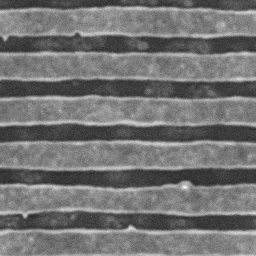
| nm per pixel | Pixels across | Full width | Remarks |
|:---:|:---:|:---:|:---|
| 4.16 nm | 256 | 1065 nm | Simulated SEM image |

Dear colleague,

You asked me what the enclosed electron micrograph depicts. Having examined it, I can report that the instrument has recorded parallel lines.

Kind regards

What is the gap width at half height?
0.0748 um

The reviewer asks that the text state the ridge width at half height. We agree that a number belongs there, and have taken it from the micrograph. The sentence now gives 0.11 micrometres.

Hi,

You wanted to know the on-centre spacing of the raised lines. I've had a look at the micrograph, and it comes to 184 nm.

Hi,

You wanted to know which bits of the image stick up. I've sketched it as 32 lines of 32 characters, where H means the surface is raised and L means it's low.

LLLLLLLLLLLLLLLLLLLLLLLLLLLLLLLL
HHHHHHHHHHHHHHHHHHHHHHHHHHHHHHHH
HHHHHHHHHHHHHHHHHHHHHHHHHHHHHHHH
HHHHHHHHHHHHHHHHHHHHHHHHHHHHHHHH
HLLLLLLLLLLLLLLLLLLHHHHHLHHLLLLL
LLLLLLLLLLLLLLLLLLLLLLLLLLLLLLLL
LLLLLLLLLLLLLLLLLLLLLLLLLLLLLLLL
HHHHHHHHHHHHHHHHHHHHHHHHHHHHHHHH
HHHHHHHHHHHHHHHHHHHHHHHHHHHHHHHH
HHHHHHHHHHHHHHHHHHHHHHHHHHHHHHHH
LLLLLLLLLLLLLLLLLLLLLLLLLLLLLLLL
LLLLLLLLLLLLLLLLLLLLLLLLLLLLLLLL
HHHHHHHHHHHHHHHHHHHHHHHHHLHHHHHH
HHHHHHHHHHHHHHHHHHHHHHHHHHHHHHHH
HHHHHHHHHHHHHHHHHHHHHHHHHHHHHHHH
HHHHHLLLLLLHHHLLLHHHLHHHHHHLHHHH
LLLLLLLLLLLLLLLLLLLLLLLLLLLLLLLL
LLLLLLLLLLLLLLLLLLLLLLLLLLLLLLLL
HHHHHHHHHHHHHHHHHHHHHHHHHHHHHHHH
HHHHHHHHHHHHHHHHHHHHHHHHHHHHHHHH
HHHHHHHHHHHHHHHHHHHHHHHHHHHHHHHH
LLLLLLLLLLLLLLLLLLLLLLLLLLLLLLLL
LLLLLLLLLLLLLLLLLLLLLLLLLLLLLLLL
HHHHHHHHHHHHLLLLLLHHHHHHHHHHHHHH
HHHHHHHHHHHHHHHHHHHHHHHHHHHHHHHH
HHHHHHHHHHHHHHHHHHHHHHHHHHHHHHHH
HHHHHLLLLLLLLLLLHHHHHHHHHHHHHHHH
LLLLLLLLLLLLLLLLLLLLLLLLLLLLLLLL
LLLLLLLLLLLLLLLLHLLLLLLLLLLLLLLL
HHHHHHHHHHHHHHHHHHHHHHHHHHHHHHHH
HHHHHHHHHHHHHHHHHHHHHHHHHHHHHHHH
HHHHHHHHHHHHHHHHHHHHHHHHHHHHHHHH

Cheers